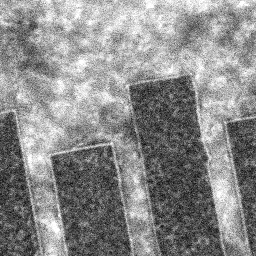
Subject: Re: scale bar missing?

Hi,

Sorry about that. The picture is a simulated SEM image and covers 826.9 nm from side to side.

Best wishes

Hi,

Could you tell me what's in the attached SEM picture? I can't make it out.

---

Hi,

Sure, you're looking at one or a few lines or trenches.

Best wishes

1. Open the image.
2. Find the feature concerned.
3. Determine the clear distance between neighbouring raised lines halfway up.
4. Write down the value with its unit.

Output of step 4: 79.8 nanometers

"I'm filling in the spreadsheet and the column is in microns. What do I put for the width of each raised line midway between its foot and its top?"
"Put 0.209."